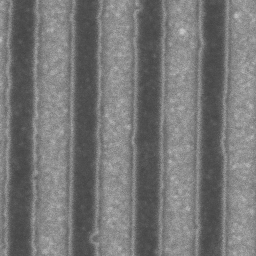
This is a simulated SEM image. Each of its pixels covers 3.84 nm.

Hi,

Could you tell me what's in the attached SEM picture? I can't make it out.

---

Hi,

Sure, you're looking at one or a few lines or trenches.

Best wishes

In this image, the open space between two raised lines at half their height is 134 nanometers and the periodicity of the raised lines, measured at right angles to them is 243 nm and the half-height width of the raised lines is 0.109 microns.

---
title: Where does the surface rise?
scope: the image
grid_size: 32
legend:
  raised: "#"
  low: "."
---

.####....####....####....####...
.####....####....####....####...
.####....###.....####....###....
.####....####....####....###....
.####....####....####....###....
.####....####....####....###....
.####....####....###.....###....
.####....####....###.....###....
.####....####....###.....###....
.####....###.....####....###....
.####....####....####....###....
.####....####....###.....###....
.####....####....###.....###....
.####....###.....###.....###....
.####....####....###.....###....
.###.....####....###.....###....
.####....###.....###.....###....
.###.....###.....###.....###....
.###.....###.....###.....###....
.####....###.....###.....###....
.####....###.....###.....###....
.####....###.....###.....###....
.###.....###.....###.....###....
.###.....###.....###.....###....
.###.....###.....###.....###....
.###.....###.....###.....###....
.###.....###.....###.....###....
.###.....###.....###.....###....
.###.....###.....###.....###....
.###.....###.....###.....###....
.###.....###.....###.....###....
.###.....###.....###....####....